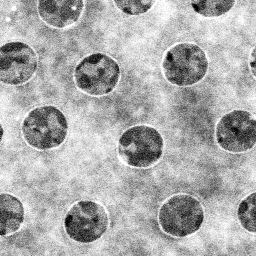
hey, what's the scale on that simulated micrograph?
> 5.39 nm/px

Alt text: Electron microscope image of raised bodies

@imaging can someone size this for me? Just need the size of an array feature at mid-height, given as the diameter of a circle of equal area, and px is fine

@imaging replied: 45.8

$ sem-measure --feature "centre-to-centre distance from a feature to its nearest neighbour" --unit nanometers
431